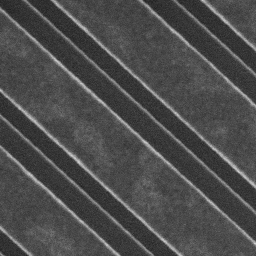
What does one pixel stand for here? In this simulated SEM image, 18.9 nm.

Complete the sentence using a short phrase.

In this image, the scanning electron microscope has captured lines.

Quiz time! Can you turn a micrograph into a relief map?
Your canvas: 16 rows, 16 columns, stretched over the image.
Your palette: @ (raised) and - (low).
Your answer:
----@@@@@----@@@
@----@@@@@----@@
@@----@@@@@@---@
@@@----@@@@@@---
@@@@----@@@@@@--
@@@@@----@@@@@@-
-@@@@@@---@@@@@@
--@@@@@@---@@@@@
---@@@@@@---@@@@
----@@@@@@----@@
@@---@@@@@@----@
@@@---@@@@@@----
@@@@---@@@@@@---
@@@@@---@@@@@@--
@@@@@@----@@@@@-
-@@@@@@----@@@@@